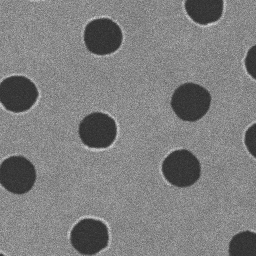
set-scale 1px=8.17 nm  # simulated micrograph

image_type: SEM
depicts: holes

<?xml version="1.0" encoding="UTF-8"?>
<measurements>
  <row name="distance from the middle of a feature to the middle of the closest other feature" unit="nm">752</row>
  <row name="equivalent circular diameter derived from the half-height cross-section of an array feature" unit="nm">311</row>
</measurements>